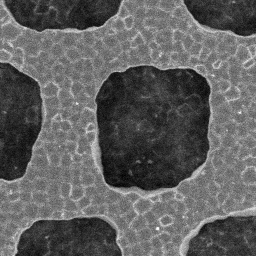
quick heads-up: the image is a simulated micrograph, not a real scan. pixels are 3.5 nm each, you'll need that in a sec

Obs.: holes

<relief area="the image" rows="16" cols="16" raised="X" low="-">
-------XXXXX----
X-----XXXXXXX---
XXXXXXXXXXXXXXXX
XXXXXXXXXXXXXXXX
-XXXXXX-----XXXX
--XXXX-------XXX
---XXX-------XXX
---XXX-------XXX
--XXXX-------XXX
--XXXX-------XXX
--XXXX------XXXX
XXXXXXX----XXXXX
XXXXXXXXXXXXXXXX
XXXXXXXXXXXXXX--
XX-----XXXXX----
X------XXXXX----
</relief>